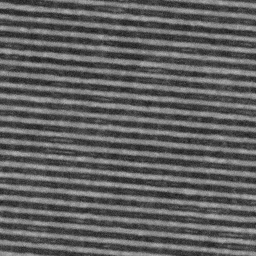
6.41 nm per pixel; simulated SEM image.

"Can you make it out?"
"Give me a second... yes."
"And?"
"parallel lines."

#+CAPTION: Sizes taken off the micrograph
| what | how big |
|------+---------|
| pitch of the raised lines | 72 nm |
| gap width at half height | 43 nanometres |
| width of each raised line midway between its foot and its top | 0.0271 microns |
